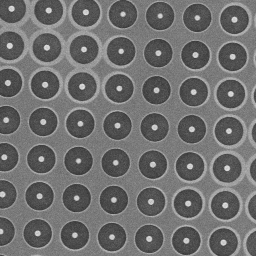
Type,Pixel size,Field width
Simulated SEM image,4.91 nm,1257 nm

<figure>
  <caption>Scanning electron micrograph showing an array of small figures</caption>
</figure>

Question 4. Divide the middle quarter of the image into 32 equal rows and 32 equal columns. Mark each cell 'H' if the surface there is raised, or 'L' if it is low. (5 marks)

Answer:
HHHHLLHHHHHHLLLHHHHHHHLLLHHHHHLL
HHHLLHHHHHHHHHHHHHHHHHHHHHHHHHHH
HHLLLLLHHHHHLLLHHHHHHHHHHHHHHHHH
HLLLLLLLHHHLLLLLHHHHHLLLLHHHHHHL
HLLLLLLLLHLLLLLLLHHHLLLLLLHHHHLL
LLLLLLLLLHLLLLLLLHHHLLLLLLLHHLLL
HLLLLLLLHHLLLLLLLLHLLLLLLLLHHLLL
HLLLLLLLHHLLLLLLLHHHLLLLLLLHHLLL
HHLLLLLHHHHLLLLLLHHHLLLLLLHHHLLL
HHHHLLHHHHHHLLLHHHHHHLLLLHHHHHLL
HHHHHHHHHHHHHHHHHHHHHHHHHHHHHHHL
HHLLLLHHHHHHHHHHHHHHHHHHHHHHHHHH
HLLLLLLHHHHLLLLHHHHHHLLLHHHHHHHH
HLLLLLLHHHLLLLLLHHHHLLLLLHHHHHLL
LLLLLLLLHHLLLLLLLHHLLLLLLLHHHLLL
LLLLLLLLHHLLLLLLLHHLLLLLLLHHLLLL
HLLLLLLHHHLLLLLLLHHLLLLLLLHHLLLL
HLLLLLLHHHLLLLLLHHHLLLLLLLHHHLLL
HHHLLHHHHHHHLLLHHHHHLLLLLHHHHLLL
HHHHHHHHHHHHHHHHHHHHHHLHHHHHHHLL
HHHHHHHHHHHHHHHHHHHHHHHHHHHHHHHH
HLLLLLHHHHHLLLLHHHHHHHHHHHHHHHHH
LLLLLLLHHHLLLLLLHHHHLLLLLHHHHHLL
LLLLLLLHHHLLLLLLHHHLLLLLLHHHHLLL
LLLLLLLHHLLLLLLLLHHLLLLLLLHHLLLL
LLLLLLLHHLLLLLLLHHHLLLLLLLHHLLLL
HLLLLLHHHHLLLLLLHHHLLLLLLLHHLLLL
HHLLLHHHHHHLLLLHHHHLLLLLLHHHLLLL
HHHHHHHHHHHHHHHHHHHHHLLLHHHHHLLL
HHHHHHHHHHHHHHHHHHHHHHHHHHHHHHHL
HLLLLHHHHHHLLLHHHHHHHHHHHHHHHHHH
LLLLLLHHHHLLLLLHHHHHLLLLHHHHHLLL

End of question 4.